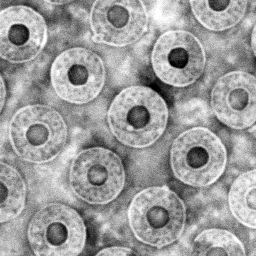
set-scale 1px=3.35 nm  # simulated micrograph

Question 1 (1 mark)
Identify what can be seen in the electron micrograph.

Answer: ring-shaped raised bodies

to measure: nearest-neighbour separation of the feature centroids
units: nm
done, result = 236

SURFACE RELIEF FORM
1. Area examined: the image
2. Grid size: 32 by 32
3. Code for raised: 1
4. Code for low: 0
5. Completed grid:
00000001000011111100000011000110
11110000000110001100000011101110
11111000000110001100000001111100
10011100000011011100000000110000
10001100000011111100111100000001
11011000000000110001111110000001
11111000111000000001100110000000
01110001111110000001100011000000
00000001100110000001110110000000
00000011000110000000111110001111
10000001100110000000011100011111
10000001111100011110000000111001
10000000111000111111000000110001
00011100000000110011100000011001
00111110000000110001100000011111
01110111000000110011100000001110
01100011000000111111000111000000
01100011000000011110001111100000
00111111000000000000001101110000
00111110001111100000011000110000
10000000011111100000011000110000
11000000011000100000001111110001
11100000011001110000000111100111
01100000011111100001100000000111
01100000001111100111110000000110
11100000000000001111111000000110
11000111100000001100011000000111
10001111110000001100011000000011
00001100111000001110111000000000
00001100111000000111110001111000
00001100110000000001100011111100
00001111110001111000000011001110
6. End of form